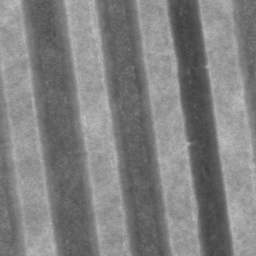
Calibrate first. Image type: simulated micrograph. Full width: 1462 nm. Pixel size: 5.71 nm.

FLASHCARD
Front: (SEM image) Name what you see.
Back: one or a few lines or trenches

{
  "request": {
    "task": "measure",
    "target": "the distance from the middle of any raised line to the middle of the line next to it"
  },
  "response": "69.3 pixels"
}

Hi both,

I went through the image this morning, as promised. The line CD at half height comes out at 199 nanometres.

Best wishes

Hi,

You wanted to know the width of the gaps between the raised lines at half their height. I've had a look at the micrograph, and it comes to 35.9 px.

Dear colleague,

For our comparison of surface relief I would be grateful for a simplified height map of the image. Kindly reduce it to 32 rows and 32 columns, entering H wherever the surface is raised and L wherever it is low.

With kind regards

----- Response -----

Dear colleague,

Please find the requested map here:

HHHLLLLLHHHHLLLLLHHHHLLLHHHHHLLL
HHHLLLLLHHHHLLLLLHHHHLLLLHHHHLLL
HHHLLLLLHHHHHLLLLHHHHLLLLHHHHLLL
HHHLLLLLHHHHHLLLLHHHHHLLLHHHHHLL
HHHHLLLLHHHHHLLLLHHHHHLLLHHHHHLL
HHHHLLLLLHHHHLLLLHHHHHLLLHHHHHLL
HHHHLLLLLHHHHLLLLLHHHHLLLHHHHHLL
HHHHLLLLLHHHHLLLLLHHHHLLLLHHHHLL
HHHHLLLLLHHHHLLLLLHHHHLLLLHHHHLL
HHHHLLLLLHHHHLLLLLHHHHLLLLHHHHHL
HHHHLLLLLHHHHHLLLLHHHHLLLLHHHHHL
HHHHLLLLLHHHHHLLLLHHHHHLLLHHHHHL
HHHHHLLLLHHHHHLLLLLHHHHLLLHHHHHL
LHHHHLLLLLHHHHLLLLLHHHHLLLHHHHHL
LHHHHLLLLLHHHHLLLLLHHHHLLLHHHHHL
LHHHHLLLLLHHHHLLLLLHHHHLLLLHHHHL
LHHHHLLLLLHHHHLLLLLHHHHLLLLHHHHH
LHHHHLLLLLHHHHHLLLLHHHHHLLLHHHHH
LHHHHLLLLLHHHHHLLLLHHHHHLLLHHHHH
LHHHHHLLLLLHHHHLLLLHHHHHLLLHHHHH
LLHHHHLLLLLHHHHLLLLLHHHHLLLHHHHH
LLHHHHLLLLLHHHHLLLLLHHHHLLLLHHHH
LLHHHHLLLLLHHHHLLLLLHHHHLLLLHHHH
LLHHHHLLLLLHHHHLLLLLHHHHLLLLHHHH
LLHHHHLLLLLHHHHLLLLLHHHHHLLLHHHH
LLHHHHLLLLLHHHHHLLLLHHHHHLLLHHHH
LLHHHHHLLLLHHHHHLLLLHHHHHLLLHHHH
LLHHHHHLLLLLHHHHLLLLHHHHHLLLHHHH
LLLHHHHLLLLLHHHHLLLLLHHHHLLLLHHH
LLLHHHHLLLLLHHHHLLLLLHHHHLLLLHHH
LLLHHHHLLLLLHHHHLLLLLHHHHLLLLHHH
LLLHHHHLLLLLHHHHHLLLLHHHHLLLLHHH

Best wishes